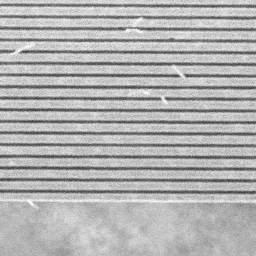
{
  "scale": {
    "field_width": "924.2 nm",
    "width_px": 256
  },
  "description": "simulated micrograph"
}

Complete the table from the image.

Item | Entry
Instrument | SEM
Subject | parallel lines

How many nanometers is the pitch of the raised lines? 42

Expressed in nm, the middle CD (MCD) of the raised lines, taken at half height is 28.9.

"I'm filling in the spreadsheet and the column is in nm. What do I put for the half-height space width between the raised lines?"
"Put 13.1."